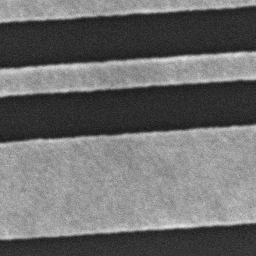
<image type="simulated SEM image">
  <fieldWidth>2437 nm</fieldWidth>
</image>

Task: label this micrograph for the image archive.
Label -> lines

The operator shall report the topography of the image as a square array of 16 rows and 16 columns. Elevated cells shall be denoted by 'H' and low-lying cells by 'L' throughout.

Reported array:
HHHHHHHHHHHHHHLL
LLLLLLLLLLLLLLLL
LLLLLLLLLLLLLLLL
LLLLLLLLLLLLHHHH
HHHHHHHHHHHHHHHH
HHHHHHHHLLLLLLLL
LLLLLLLLLLLLLLLL
LLLLLLLLLLLLLLLL
LLLLLLHHHHHHHHHH
HHHHHHHHHHHHHHHH
HHHHHHHHHHHHHHHH
HHHHHHHHHHHHHHHH
HHHHHHHHHHHHHHHH
HHHHHHHHHHHHHHHH
HHHHHHHLLLLLLLLL
LLLLLLLLLLLLLLLL